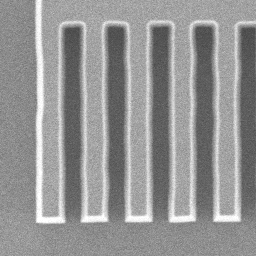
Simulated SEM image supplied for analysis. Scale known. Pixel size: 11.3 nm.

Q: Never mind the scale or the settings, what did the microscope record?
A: groups of lines, slits or small figures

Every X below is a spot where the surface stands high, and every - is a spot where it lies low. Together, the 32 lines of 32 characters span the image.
-----XXXXXXXXXXXXXXXXXXXXXXXXXXX
-----XXXXXXXXXXXXXXXXXXXXXXXXXXX
-----XXXXXXXXXXXXXXXXXXXXXXXXXXX
-----XXX--XXX---XXX--XXX---XXX--
-----XXX--XXX---XXX--XXX---XXX--
-----XXX--XXX---XXX--XXX---XXX--
-----XXX--XXX---XXX--XXX---XXX--
-----XXX--XXX---XXX--XXX---XXX--
-----XXX--XXX---XXX--XXX---XXX--
-----XXX--XXX---XXX--XXX---XXX--
-----XXX--XXX---XXX--XXX---XXX--
-----XXX--XXX---XXX--XXX---XXX--
-----XXX--XXX---XXX--XXX---XXX--
-----XXX--XXX---XXX--XXX---XXX--
-----XXX--XXX---XXX--XXX---XXX--
-----XXX--XXX---XXX--XXX---XXX--
-----XXX--XXX---XXX--XXX---XXX--
-----XXX--XXX---XXX--XXX---XXX--
-----XXX--XXX---XXX--XXX---XXX--
-----XXX--XXX---XXX---XX---XXX--
-----XXX--XXX---XXX---XX---XXX--
-----XXX--XXX---XXX--XXX---XXX--
-----XXX--XXX---XXX---XX---XXX--
-----XXX---XX---XXX--XXX---XXX--
-----XXX---XX---XXX--XXX---XXX--
-----XXX---XX---XXX--XXX---XXX--
-----XXX---XX---XXX--XXX---XXX--
-----XX-------------------------
--------------------------------
--------------------------------
--------------------------------
--------------------------------